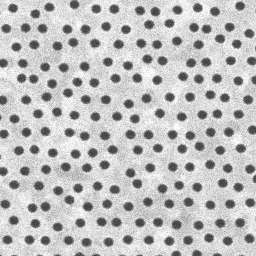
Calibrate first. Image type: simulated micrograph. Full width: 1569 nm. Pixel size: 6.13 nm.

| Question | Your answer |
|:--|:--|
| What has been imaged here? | a regular array of holes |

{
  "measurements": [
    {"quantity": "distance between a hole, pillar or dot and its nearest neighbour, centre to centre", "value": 103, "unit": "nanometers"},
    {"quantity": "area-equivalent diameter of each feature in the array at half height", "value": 0.0619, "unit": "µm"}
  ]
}